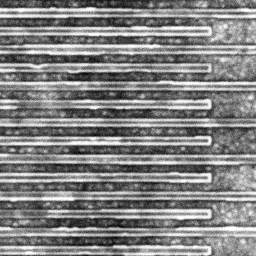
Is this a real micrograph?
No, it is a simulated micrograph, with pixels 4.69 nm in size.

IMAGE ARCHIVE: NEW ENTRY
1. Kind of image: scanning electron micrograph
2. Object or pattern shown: parallel lines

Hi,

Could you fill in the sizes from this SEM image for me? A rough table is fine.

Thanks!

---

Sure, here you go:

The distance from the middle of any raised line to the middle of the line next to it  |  85.5 nanometres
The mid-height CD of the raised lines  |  38.1 nm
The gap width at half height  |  46.9 nm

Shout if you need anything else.